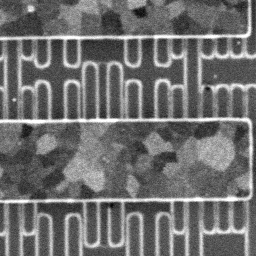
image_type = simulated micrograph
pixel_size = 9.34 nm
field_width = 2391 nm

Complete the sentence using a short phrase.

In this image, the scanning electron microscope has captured wiring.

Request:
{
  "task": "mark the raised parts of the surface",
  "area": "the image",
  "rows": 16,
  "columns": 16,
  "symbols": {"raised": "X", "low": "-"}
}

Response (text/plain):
XXXXXXXXXXXXXXXX
XXXXXXXXXXXXXXXX
----------------
----------------
----------------
----------------
----------------
-------XXXXXXXX-
XXXXXXXXXXXXXXXX
XXXXXXXXXXXXXXXX
XXXXXXXXXXXXXXXX
XXXXXXXXXXXXXXXX
XXXXXXXX--------
----------------
----------------
----------------